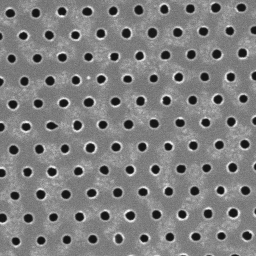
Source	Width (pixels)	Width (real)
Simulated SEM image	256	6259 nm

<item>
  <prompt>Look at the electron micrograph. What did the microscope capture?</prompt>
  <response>a regular array of holes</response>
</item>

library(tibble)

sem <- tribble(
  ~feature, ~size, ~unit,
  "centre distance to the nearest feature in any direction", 25.4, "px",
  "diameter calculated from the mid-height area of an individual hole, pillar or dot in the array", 226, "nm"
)